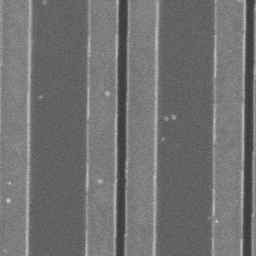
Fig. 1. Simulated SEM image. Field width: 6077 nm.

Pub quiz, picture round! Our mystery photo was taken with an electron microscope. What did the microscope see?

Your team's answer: lines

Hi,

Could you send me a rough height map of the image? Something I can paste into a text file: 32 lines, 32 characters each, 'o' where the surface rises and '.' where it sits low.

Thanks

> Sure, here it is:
....ooooooo....o....ooooooo....o
....ooooooo....o....ooooooo....o
....ooooooo....o....ooooooo....o
....ooooooo....o....ooooooo....o
....ooooooo....o....ooooooo....o
....ooooooo....o....ooooooo...oo
....ooooooo....o....ooooooo...oo
....ooooooo....o....ooooooo...oo
....ooooooo....o....ooooooo...oo
....ooooooo....o....ooooooo...oo
....ooooooo....o....ooooooo...oo
....ooooooo....o....ooooooo...oo
....ooooooo....o....ooooooo...oo
....ooooooo....o....ooooooo...oo
....ooooooo...oo....ooooooo...oo
....ooooooo...oo....ooooooo...oo
....ooooooo...oo....ooooooo...oo
....ooooooo...oo...oooooooo...oo
....ooooooo...oo...oooooooo...oo
....ooooooo...oo...oooooooo...oo
....ooooooo...oo...oooooooo...oo
....ooooooo...oo...oooooooo...oo
....ooooooo...oo...oooooooo...oo
....ooooooo...oo...oooooooo...oo
...oooooooo...oo...oooooooo...oo
...oooooooo...oo...oooooooo...oo
...oooooooo...oo...oooooooo...oo
...oooooooo...oo...oooooooo...oo
...oooooooo...oo...oooooooo...oo
...oooooooo...oo...oooooooo...oo
...oooooooo...oo...oooooooo...oo
...oooooooo...oo...oooooooo...oo